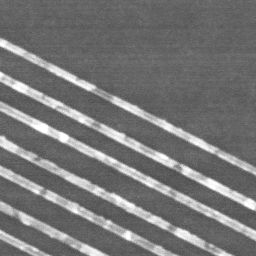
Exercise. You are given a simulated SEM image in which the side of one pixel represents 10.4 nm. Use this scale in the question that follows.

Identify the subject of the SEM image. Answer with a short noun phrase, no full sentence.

parallel lines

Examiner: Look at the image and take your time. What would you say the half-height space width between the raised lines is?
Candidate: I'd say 24.3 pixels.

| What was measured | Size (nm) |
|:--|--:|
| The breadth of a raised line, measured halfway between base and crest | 70.7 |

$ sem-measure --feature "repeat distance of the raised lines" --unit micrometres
0.302